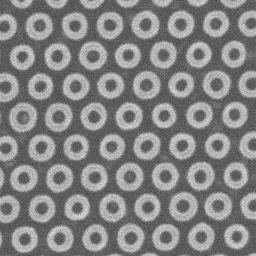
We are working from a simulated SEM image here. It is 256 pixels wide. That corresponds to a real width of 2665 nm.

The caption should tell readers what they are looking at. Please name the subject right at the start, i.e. a regular array of ring-shaped raised bodies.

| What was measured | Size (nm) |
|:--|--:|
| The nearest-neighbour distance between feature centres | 360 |